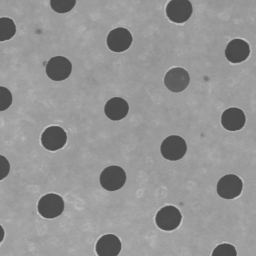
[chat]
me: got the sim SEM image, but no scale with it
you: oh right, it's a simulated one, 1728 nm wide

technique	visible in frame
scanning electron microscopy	a regular array of holes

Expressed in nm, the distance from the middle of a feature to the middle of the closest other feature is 452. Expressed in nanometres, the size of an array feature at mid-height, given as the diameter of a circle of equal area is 171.